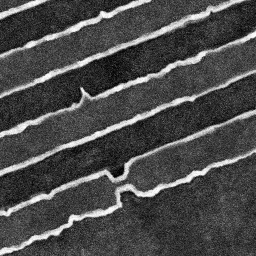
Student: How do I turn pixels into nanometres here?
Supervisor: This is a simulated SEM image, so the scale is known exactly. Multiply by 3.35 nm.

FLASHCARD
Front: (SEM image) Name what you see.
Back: one or a few lines or trenches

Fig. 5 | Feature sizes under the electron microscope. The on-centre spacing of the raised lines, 244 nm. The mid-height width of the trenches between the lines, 114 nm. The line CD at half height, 128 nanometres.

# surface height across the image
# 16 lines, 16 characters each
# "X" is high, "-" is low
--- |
XX-----XXXXXXX--
-----XXXXXX-----
--XXXXXXX------X
XXXXXX------XXXX
XXXX------XXXXXX
X------XXXXXXX--
-----XXXXXX-----
--XXXXXXX-----XX
XXXXXX------XXXX
XXX------XXXXXXX
X-------XXXXX---
----XXXXXXX-----
--XXXXX---------
XXXXXX----------
XXXX------------
X---------------